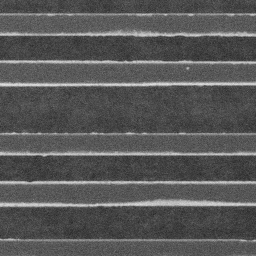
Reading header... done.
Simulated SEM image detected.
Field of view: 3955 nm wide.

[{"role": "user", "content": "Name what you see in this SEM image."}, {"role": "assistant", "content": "lines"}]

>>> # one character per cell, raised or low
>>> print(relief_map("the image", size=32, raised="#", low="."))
................................
................................
################################
################################
................................
................................
................................
................................
################################
################################
####################....##......
................................
................................
................................
................................
................................
................................
################################
################################
................................
................................
................................
................................
################################
################################
##################........######
................................
................................
................................
................................
################################
################################